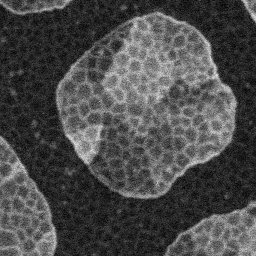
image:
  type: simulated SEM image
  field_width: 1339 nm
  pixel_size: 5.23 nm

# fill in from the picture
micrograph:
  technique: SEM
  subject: raised bodies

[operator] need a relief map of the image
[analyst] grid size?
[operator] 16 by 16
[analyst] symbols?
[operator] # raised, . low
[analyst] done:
.###...........#
........####....
......#######...
.....########...
....##########..
....##########..
....###########.
....###########.
....##########..
#....#########..
#.....######....
##.....####.....
###.............
###..........###
###.........####
###........#####